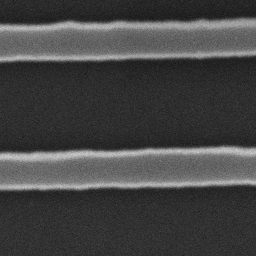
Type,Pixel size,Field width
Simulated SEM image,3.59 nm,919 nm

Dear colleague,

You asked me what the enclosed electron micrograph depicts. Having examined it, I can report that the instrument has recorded lines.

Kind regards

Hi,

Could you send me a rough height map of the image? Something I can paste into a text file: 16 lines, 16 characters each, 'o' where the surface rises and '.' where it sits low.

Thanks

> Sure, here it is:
................
....o..o..oooooo
oooooooooooooooo
oooooooooooooo..
................
................
................
................
................
........oooooooo
oooooooooooooooo
oooooooooooooo..
................
................
................
................